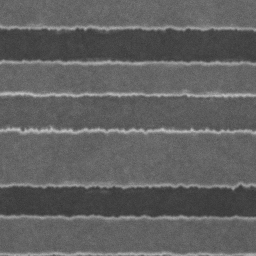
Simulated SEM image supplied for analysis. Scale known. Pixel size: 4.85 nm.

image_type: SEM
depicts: lines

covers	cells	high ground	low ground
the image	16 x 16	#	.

################
################
................
................
################
################
################
################
################
################
################
################
................
................
################
################